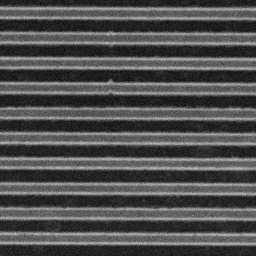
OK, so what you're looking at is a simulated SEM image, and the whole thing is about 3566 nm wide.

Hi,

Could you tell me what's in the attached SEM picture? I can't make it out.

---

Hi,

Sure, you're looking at parallel lines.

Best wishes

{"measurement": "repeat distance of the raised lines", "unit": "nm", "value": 349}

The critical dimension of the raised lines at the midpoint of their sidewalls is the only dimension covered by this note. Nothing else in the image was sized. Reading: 136 nm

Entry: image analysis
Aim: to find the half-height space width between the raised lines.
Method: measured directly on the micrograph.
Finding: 15.5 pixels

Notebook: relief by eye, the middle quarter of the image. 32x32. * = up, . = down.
********************************
................................
................................
................................
...........*....................
********************************
********************************
................................
................................
................................
................................
********************************
********************************
...................*************
................................
................................
................................
................................
********************************
********************************
................................
................................
................................
................................
********************************
********************************
................................
................................
................................
................................
********************************
********************************